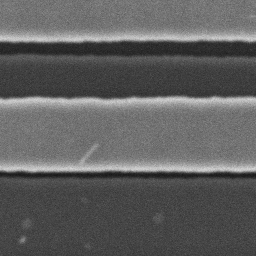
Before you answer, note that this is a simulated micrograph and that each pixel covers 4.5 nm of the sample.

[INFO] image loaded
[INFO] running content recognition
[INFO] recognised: lines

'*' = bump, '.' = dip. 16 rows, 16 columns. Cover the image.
****************
****************
**********.*****
................
................
................
****************
****************
****************
****************
****************
................
................
................
................
................